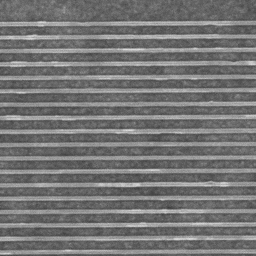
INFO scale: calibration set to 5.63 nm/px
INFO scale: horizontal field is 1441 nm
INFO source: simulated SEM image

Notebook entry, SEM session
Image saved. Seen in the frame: parallel lines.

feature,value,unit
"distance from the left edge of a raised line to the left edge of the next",75.6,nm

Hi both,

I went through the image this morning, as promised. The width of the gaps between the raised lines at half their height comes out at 57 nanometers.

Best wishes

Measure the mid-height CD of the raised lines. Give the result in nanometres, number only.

20.4